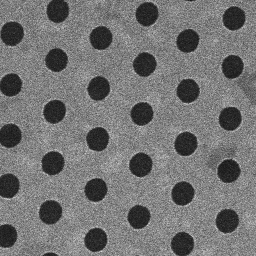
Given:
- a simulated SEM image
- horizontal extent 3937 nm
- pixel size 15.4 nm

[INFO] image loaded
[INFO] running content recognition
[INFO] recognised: a regular array of holes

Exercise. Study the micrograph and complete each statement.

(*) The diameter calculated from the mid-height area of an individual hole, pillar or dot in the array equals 371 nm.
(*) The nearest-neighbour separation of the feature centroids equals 763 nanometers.